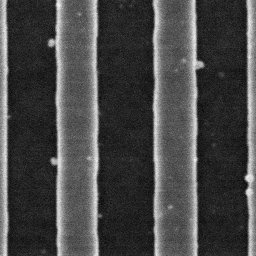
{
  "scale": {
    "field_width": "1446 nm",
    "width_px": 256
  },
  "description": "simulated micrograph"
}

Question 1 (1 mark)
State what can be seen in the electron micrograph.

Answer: lines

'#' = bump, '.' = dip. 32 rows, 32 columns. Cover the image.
#......#####.......#####.......#
#......#####.......#####.......#
#......#####.......#####.......#
#......#####.......#####.......#
#......#####.......#####.......#
#......#####.......#####.......#
#......#####.......#####.......#
#......#####.......#####.......#
#......#####.......#####.......#
#......#####.......#####.......#
#......#####.......#####.......#
#......#####.......######......#
#......#####.......######......#
#......#####.......#####.......#
#......#####.......######......#
#......#####.......######......#
#......#####.......######......#
#......#####.......#####.......#
#......#####.......#####.......#
#......#####.......######......#
#......#####.......######......#
#......#####.......#####.......#
#......#####.......######......#
#......#####.......######......#
#......#####.......######......#
#......#####.......######......#
#......#####.......######......#
#......#####.......######......#
#......#####.......######......#
#......#####.......######......#
#......#####.......######......#
#......#####.......######......#